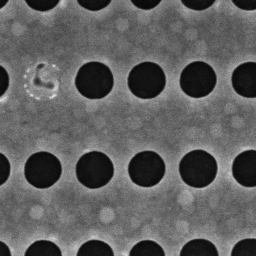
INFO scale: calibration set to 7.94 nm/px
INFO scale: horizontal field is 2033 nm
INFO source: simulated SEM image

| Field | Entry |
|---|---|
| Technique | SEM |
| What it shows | holes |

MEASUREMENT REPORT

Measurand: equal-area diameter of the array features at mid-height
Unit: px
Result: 38.2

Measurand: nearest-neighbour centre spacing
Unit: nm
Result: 411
